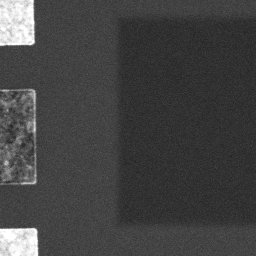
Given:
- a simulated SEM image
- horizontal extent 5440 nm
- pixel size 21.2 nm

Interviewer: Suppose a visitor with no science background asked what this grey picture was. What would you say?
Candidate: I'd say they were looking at wiring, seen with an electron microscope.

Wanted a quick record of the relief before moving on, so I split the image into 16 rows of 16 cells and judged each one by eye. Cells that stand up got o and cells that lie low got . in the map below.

oo..............
oo..............
oo..............
................
................
................
oo..............
oo..............
oo..............
oo..............
oo..............
................
................
................
oo..............
oo..............